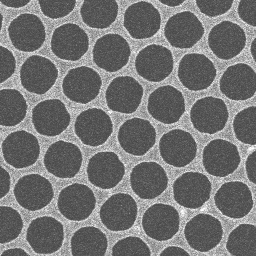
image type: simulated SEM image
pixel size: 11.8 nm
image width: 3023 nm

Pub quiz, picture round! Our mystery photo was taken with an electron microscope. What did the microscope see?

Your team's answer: a regular array of holes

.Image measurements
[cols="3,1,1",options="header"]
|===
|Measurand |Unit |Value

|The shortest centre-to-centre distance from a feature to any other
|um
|0.51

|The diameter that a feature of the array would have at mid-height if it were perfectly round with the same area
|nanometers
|449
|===